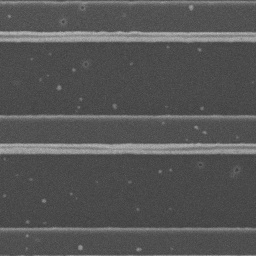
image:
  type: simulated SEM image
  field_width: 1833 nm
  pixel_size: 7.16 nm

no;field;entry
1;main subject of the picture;lines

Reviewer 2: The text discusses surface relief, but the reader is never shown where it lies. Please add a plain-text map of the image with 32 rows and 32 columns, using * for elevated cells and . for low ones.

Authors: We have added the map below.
********************************
********************************
********************************
********************************
********************************
................................
................................
................................
................................
................................
................................
................................
................................
................................
................................
********************************
********************************
********************************
********************************
................................
................................
................................
................................
................................
................................
................................
................................
................................
................................
********************************
********************************
********************************